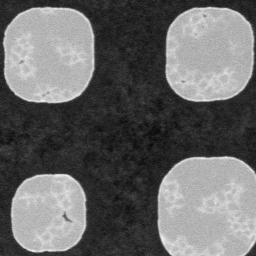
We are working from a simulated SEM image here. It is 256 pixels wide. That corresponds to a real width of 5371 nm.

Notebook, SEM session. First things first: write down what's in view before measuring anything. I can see raised bodies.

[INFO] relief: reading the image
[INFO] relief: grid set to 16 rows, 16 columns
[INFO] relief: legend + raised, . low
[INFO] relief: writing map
.............+..
.+++++.....+++++
++++++.....+++++
++++++.....+++++
++++++.....+++++
.++++......++++.
................
................
................
................
...........+++++
.++++.....++++++
.++++.....++++++
.++++.....++++++
.++++.....++++++
..++......++++++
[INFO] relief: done